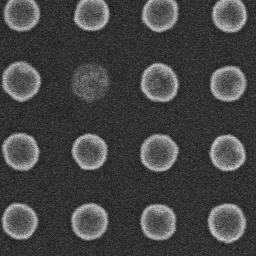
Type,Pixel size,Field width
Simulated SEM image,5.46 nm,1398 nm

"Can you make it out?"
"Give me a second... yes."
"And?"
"a regular array of raised bodies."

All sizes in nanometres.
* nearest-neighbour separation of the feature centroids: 374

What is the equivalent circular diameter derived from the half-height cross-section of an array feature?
33.8 pixels